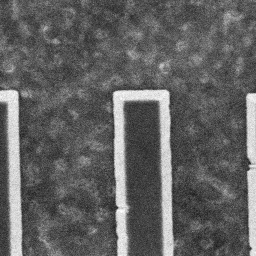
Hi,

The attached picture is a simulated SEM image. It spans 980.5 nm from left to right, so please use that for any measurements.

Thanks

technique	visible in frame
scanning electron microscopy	one or a few lines or trenches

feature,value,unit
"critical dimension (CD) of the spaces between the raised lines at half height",367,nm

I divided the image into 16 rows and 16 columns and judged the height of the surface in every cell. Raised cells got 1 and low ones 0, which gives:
0000000000000000
0000000000000000
0000000000000000
0000000000000000
0000000000000000
0000000000000000
1000000111000000
1000000111000000
1000000111000000
1000000111000000
1000000111000000
1000000111000000
1000000011000000
1000000011000000
1000000011000000
1000000011100000